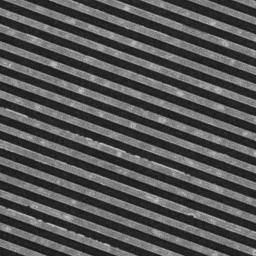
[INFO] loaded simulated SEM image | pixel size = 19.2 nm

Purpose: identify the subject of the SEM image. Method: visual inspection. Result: parallel lines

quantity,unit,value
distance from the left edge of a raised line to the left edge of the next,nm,298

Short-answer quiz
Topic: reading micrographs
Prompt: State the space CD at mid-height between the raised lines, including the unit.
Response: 0.178 µm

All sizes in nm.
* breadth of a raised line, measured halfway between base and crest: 129